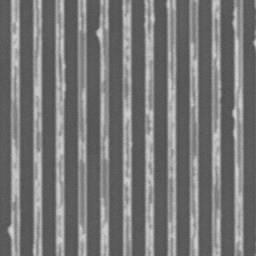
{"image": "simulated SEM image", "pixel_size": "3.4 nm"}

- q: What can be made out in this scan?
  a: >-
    parallel lines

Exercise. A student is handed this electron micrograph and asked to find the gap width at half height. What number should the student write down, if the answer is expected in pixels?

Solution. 15.2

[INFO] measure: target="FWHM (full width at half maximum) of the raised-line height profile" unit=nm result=22.9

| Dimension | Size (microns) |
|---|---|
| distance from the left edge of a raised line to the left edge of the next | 0.0758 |